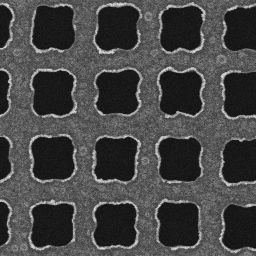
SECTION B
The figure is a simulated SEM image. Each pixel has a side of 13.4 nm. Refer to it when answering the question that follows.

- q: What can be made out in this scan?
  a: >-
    a regular array of holes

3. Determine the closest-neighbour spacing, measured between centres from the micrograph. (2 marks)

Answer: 0.851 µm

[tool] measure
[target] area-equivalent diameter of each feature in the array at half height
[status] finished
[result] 46 px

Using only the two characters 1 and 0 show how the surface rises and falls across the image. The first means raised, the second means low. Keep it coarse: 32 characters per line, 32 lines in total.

11111111111111111111111111111111
01110000011100000111000001110000
01110000011100000111000001110000
01110000011100000111000001110000
01110000011100000111000001110000
01110000011100000111000001110000
11111111111111111111111111111111
11111111111111111111111111111111
11111111111111111111111111111111
01110000011100000111000001110000
01110000011100000111000001110000
01110000011100000111000001110000
01110000011100000111000001110000
01110000011100000111000001110000
11111111111111111111111111111011
11111111111111111111111111111111
11111111111111111111111111111111
01110000011100000111000001111111
01110000011100000111000001110000
01110000011100000111000001110000
01110000011100000111000001110000
01110000011100000111000001110000
11111011111111101111100011110000
11111111111111111111111111111111
11111111111111111111111111111111
01111010011110101111000011111111
01110000011100000111000001110000
01110000011100000111000001110000
01110000011100000111000001110000
01110000011100000111000001110000
01110000111100000111000011110000
11111111111111111111111111111111